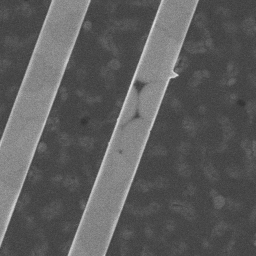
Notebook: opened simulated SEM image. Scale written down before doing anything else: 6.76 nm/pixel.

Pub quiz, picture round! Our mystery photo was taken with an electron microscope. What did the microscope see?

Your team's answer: one or a few lines or trenches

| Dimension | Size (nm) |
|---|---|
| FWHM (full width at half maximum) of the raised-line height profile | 232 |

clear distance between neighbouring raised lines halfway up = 0.452 micrometres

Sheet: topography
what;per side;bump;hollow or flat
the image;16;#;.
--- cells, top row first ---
...##.....##....
...##.....##....
..###....##.....
..##.....##.....
..##.....##.....
.###............
.##......#......
.##.............
###....##.......
##.....##.......
##....###.......
#.....##........
#.....##........
#....##.........
.....##.........
....###.........